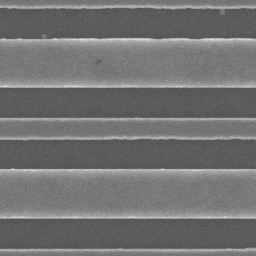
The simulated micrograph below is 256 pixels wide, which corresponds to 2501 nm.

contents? lines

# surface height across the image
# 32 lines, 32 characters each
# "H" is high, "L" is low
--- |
HHHHHHHHHHHHHHHHHHHHHHHHHHHHHHHH
LLLLLLLLLLLLLLLLLLLLLLLLLLLLLLLL
LLLLLLLLLLLLLLLLLLLLLLLLLLLLLLLL
LLLLLLLLLLLLLLLLLLLLLLLLLLLLLLLL
LLLLLLLLLLLLLLLLLLLLLLLLLLLLLLLL
HHHHHHHHHHHHHHHHHHHHHHHHHHHHHHHH
HHHHHHHHHHHHHHHHHHHHHHHHHHHHHHHH
HHHHHHHHHHHHHHHHHHHHHHHHHHHHHHHH
HHHHHHHHHHHHHHHHHHHHHHHHHHHHHHHH
HHHHHHHHHHHHHHHHHHHHHHHHHHHHHHHH
HHHHHHHHHHHHHHHHHHHHHHHHHHHHHHHH
LLLLLLLLLLLLLLLLLLLLLLLLLLLLLLLL
LLLLLLLLLLLLLLLLLLLLLLLLLLLLLLLL
LLLLLLLLLLLLLLLLLLLLLLLLLLLLLLLL
LLLLLLLLLLLLLLLLLLLLLLLLLLLLLLLL
HHHHHHHHHHHHHHHHHHHHHHHHHHHHHHHH
HHHHHHHHHHHHHHHHHHHHHHHHHHHHHHHH
LLLLLLLLLLLLLLLLLLLLLLLLLLLLLLLL
LLLLLLLLLLLLLLLLLLLLLLLLLLLLLLLL
LLLLLLLLLLLLLLLLLLLLLLLLLLLLLLLL
LLLLLLLLLLLLLLLLLLLLLLLLLLLLLLLL
HHHHHHHHHHHHHHHHHHHHHHHHHHHHHHHH
HHHHHHHHHHHHHHHHHHHHHHHHHHHHHHHH
HHHHHHHHHHHHHHHHHHHHHHHHHHHHHHHH
HHHHHHHHHHHHHHHHHHHHHHHHHHHHHHHH
HHHHHHHHHHHHHHHHHHHHHHHHHHHHHHHH
HHHHHHHHHHHHHHHHHHHHHHHHHHHHHHHH
LLLLLLLLLLLLLLLLLLLLLLLLLLLLLLLL
LLLLLLLLLLLLLLLLLLLLLLLLLLLLLLLL
LLLLLLLLLLLLLLLLLLLLLLLLLLLLLLLL
LLLLLLLLLLLLLLLLLLLLLLLLLLLLLLLL
HHHHHHHHHHHHHHHHHHHHHHHHHHHHHHHH